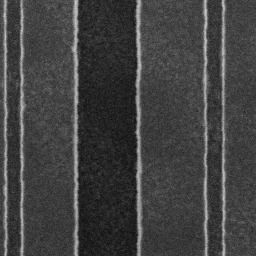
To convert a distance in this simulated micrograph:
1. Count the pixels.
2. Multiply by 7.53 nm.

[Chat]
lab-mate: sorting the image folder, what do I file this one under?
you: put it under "lines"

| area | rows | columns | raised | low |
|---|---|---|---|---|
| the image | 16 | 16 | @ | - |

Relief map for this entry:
@@@@@----@@@@@@@
@@@@@----@@@@@@@
@@@@@----@@@@@@@
@@@@@----@@@@@@@
@@@@@----@@@@@@@
@@@@@----@@@@@@@
@@@@@----@@@@@@@
@@@@@----@@@@@@@
@@@@@----@@@@@@@
@@@@@----@@@@@@@
@@@@@----@@@@@@@
@@@@@----@@@@@@@
@@@@@----@@@@@@@
@@@@@----@@@@@@@
@@@@@----@@@@@@@
@@@@@----@@@@@@@